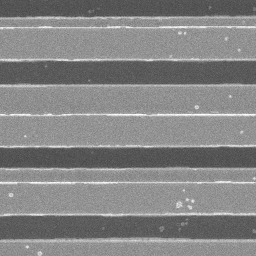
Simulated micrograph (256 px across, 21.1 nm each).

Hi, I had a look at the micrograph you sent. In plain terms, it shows lines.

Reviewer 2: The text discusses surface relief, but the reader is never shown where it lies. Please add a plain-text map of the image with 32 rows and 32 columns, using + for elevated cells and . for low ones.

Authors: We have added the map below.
................................
................................
++++++++++++++++++++++++++++++++
++++++++++++++++++++++++++++++++
++++++++++++++++++++++++++++++++
++++++++++++++++++++++++++++++++
++++++++++++++++++++++++++++++++
++++...++++++.....++.++.........
................................
................................
................................
++++++++++++++++++++++++++++++++
++++++++++++++++++++++++++++++++
++++++++++++++++++++++++++++++++
++++++++++++++++++++++++++++++++
++++++++++++++++++++++++++++++++
++++++++++++++++++++++++++++++++
++++++++++++++++++++++++++++++++
................................
................................
................................
++++++++++++++++++++++++++++++++
++++++++++++++++++++++++++++++++
++++++++++++++++++++++++++++++++
++++++++++++++++++++++++++++++++
++++++++++++++++++++++++++++++++
++++++++++++++++++++++++++++++++
................................
................................
................................
++++++++++++++++++++++++++++++++
++++++++++++++++++++++++++++++++